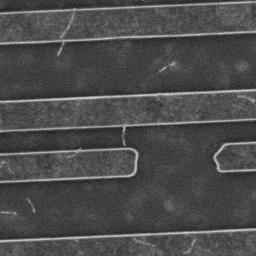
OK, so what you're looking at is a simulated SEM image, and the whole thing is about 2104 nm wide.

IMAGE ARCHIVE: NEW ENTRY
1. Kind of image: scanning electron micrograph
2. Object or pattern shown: one or a few lines or trenches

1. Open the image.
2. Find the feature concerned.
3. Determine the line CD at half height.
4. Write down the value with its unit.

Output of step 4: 244 nm